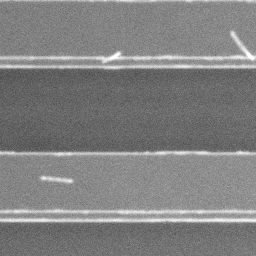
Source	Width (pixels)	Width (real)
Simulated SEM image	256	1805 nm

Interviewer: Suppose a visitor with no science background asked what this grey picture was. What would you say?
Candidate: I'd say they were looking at lines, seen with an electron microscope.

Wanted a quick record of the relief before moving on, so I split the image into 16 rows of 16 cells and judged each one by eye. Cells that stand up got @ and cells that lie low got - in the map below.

@@@@@@@@@@@@@@@@
@@@@@@@@@@@@@@@@
@@@@@@@@@@@@@@@@
@@@@@@@@@@@@@@@@
----------------
----------------
----------------
----------------
----------------
----------------
@@@@@@@@@@@@@@@@
@@@@@@@@@@@@@@@@
@@@@@@@@@@@@@@@@
@@@@@@@@@@@@@@@@
----------------
----------------